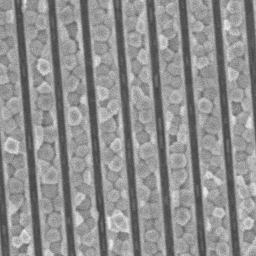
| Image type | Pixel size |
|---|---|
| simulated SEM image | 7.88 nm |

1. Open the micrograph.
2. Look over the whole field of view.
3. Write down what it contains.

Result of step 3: parallel lines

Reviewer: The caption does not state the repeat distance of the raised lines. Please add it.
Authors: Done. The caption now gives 32.7 pixels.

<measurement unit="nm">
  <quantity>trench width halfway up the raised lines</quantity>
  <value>67.7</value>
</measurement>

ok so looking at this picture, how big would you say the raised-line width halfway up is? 196 nanometers